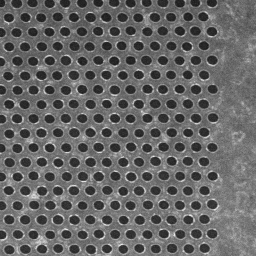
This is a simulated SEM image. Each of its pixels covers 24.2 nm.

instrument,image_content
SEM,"a regular array of holes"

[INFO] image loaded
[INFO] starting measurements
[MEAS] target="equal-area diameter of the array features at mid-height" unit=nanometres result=241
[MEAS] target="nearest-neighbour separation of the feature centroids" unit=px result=15.9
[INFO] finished